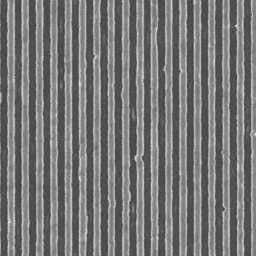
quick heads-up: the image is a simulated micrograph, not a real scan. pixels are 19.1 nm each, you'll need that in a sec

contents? parallel lines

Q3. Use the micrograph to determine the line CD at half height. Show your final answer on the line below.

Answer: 112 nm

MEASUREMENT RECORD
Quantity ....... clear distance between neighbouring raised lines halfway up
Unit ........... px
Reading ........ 7.87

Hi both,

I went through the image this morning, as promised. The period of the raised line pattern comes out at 275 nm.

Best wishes